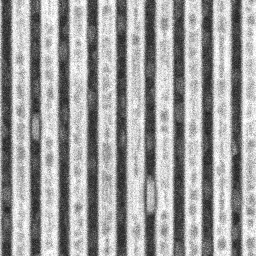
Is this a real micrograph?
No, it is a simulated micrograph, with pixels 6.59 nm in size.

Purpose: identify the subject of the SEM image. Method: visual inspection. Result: parallel lines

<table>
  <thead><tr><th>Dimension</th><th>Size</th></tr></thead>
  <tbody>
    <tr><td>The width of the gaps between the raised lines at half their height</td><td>0.105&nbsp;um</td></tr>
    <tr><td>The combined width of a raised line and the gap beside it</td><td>190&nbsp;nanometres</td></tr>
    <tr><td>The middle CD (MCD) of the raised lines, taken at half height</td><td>88.1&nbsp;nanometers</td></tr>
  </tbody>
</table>